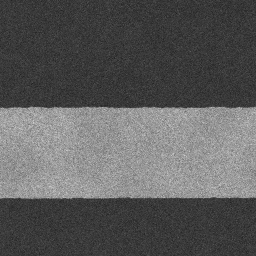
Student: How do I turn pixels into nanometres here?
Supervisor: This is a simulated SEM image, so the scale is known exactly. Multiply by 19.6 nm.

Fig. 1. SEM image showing one or a few lines or trenches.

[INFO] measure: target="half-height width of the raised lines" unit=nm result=1760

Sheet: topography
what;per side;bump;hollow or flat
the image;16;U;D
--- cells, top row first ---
DDDDDDDDDDDDDDDD
DDDDDDDDDDDDDDDD
DDDDDDDDDDDDDDDD
DDDDDDDDDDDDDDDD
DDDDDDDDDDDDDDDD
DDDDDDDDDDDDDDDD
DDDDDDDDDDDDDDDD
UUUUUUUUUUUUUUUU
UUUUUUUUUUUUUUUU
UUUUUUUUUUUUUUUU
UUUUUUUUUUUUUUUU
UUUUUUUUUUUUUUUU
DDDDDDDDDDDDDDDD
DDDDDDDDDDDDDDDD
DDDDDDDDDDDDDDDD
DDDDDDDDDDDDDDDD